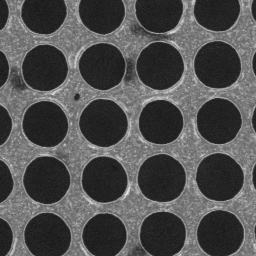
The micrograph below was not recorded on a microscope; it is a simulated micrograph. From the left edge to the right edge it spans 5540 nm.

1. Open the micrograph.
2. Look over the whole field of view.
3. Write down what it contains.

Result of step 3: a regular array of holes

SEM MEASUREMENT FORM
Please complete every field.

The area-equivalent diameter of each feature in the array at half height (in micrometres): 1.02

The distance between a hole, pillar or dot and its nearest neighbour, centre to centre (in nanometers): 1210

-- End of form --